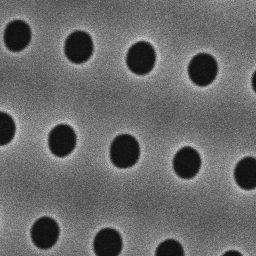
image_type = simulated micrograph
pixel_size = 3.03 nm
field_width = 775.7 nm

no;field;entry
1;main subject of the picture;a regular array of holes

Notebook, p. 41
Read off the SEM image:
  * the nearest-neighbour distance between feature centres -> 191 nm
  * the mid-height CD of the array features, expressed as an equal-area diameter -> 94.2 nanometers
